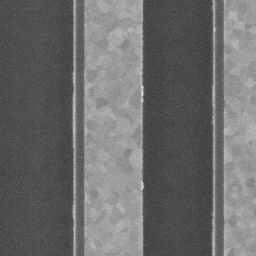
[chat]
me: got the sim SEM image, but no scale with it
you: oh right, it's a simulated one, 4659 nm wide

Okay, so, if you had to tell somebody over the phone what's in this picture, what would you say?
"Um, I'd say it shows lines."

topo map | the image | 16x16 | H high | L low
LLLLLHHHHLLLLHHH
LLLLLHHHHLLLLHHH
LLLLLHHHHLLLLHHH
LLLLLHHHHLLLLHHH
LLLLLHHHHLLLLHHH
LLLLLHHHHLLLLHHH
LLLLLHHHHLLLLHHH
LLLLLHHHHLLLLHHH
LLLLLHHHHLLLLHHH
LLLLLHHHHLLLLHHH
LLLLLHHHHLLLLHHH
LLLLLHHHHLLLLHHH
LLLLLHHHHLLLLHHH
LLLLLHHHHLLLLHHH
LLLLLHHHHLLLLHHH
LLLLLHHHHLLLLHHH